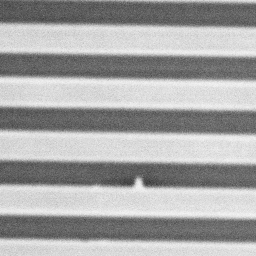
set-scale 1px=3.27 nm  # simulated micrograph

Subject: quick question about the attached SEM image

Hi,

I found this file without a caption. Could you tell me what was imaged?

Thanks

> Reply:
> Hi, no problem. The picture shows parallel lines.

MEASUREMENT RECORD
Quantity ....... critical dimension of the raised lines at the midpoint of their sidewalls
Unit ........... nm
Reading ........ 86.3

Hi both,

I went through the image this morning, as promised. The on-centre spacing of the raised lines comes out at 0.176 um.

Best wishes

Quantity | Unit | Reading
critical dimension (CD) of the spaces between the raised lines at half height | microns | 0.0892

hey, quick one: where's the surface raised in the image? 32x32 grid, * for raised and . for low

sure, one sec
................................
................................
................................
**************************......
********************************
********************************
........************************
................................
................................
................................
********************************
********************************
********************************
..........................******
................................
................................
................................
********************************
********************************
********************************
................................
................................
................................
*******..*****..**..............
********************************
********************************
********************************
................................
................................
................................
*************************.......
********************************